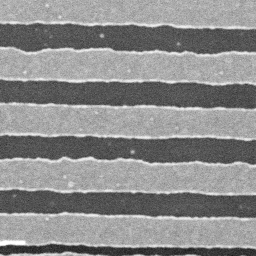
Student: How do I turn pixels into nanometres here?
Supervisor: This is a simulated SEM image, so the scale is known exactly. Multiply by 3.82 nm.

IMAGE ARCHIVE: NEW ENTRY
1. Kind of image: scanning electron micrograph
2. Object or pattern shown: lines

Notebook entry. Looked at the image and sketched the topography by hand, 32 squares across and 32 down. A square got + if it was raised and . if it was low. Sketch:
++++++++++++++++++++++++++++++++
++++++++++++++++++++++++++++++++
++++++++++++++++++++++++++++++++
........................++++++++
................................
................................
+++.+++++++++++++.+++..+....+++.
++++++++++++++++++++++++++++++++
++++++++++++++++++++++++++++++++
++++++++++++++++++++++++++++++++
..........................++...+
................................
................................
++++++++++++++++++++++..........
++++++++++++++++++++++++++++++++
++++++++++++++++++++++++++++++++
++++++++++++++++++++++++++++++++
................................
................................
................................
++++++++++++++++++++++++++.+.++.
++++++++++++++++++++++++++++++++
++++++++++++++++++++++++++++++++
++++++++++++++++++++++++++++++++
................................
................................
................................
++++++++++++++++++++++++++++++++
++++++++++++++++++++++++++++++++
++++++++++++++++++++++++++++++++
++++++..++++++++++++++++++++++++
................................